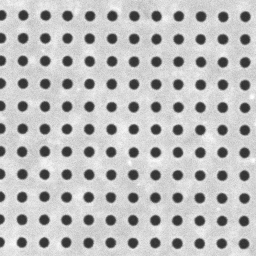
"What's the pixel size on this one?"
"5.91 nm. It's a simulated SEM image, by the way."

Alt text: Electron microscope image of a regular array of holes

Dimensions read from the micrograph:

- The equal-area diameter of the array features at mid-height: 62.2 nm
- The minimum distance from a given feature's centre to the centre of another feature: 130 nm